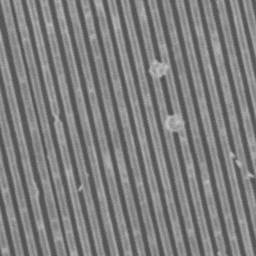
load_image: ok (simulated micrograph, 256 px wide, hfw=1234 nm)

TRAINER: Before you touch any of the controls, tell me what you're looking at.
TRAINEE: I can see parallel lines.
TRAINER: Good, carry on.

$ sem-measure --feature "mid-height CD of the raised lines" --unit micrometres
0.0288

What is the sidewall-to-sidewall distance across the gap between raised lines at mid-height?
33.5 nanometers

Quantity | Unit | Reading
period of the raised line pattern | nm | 63.5